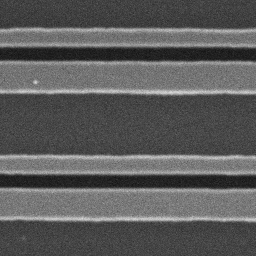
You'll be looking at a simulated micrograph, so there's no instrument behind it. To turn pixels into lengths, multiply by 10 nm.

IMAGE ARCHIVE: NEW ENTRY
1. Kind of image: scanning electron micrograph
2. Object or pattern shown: lines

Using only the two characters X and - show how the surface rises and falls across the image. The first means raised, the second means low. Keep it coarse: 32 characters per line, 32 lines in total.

--------------------------------
--------------------------------
--------------------------------
--------------------------------
XXXXXXXXXXXXXXXXXXXXXXXXXXXXXXXX
XXXXXXXXXXXXXXXXXXXXXXXXXXXXXXXX
--------------------------------
--------------------------------
XXXXXXXXXXXXXXXXXXXXXXXXXXXXXXXX
XXXXXXXXXXXXXXXXXXXXXXXXXXXXXXXX
XXXXXXXXXXXXXXXXXXXXXXXXXXXXXXXX
-----XX---------XXXXXXXXXXXXXXXX
--------------------------------
--------------------------------
--------------------------------
--------------------------------
--------------------------------
--------------------------------
--------------------------------
--------------------------------
XXXXXXXXXXXXXXXXXXXXXXXXXXXXXXXX
XXXXXXXXXXXXXXXXXXXXXXXXXXXXXXXX
--------------------------------
--------------------------------
XXXXXXXXXXXXXXXXXXXXXXXXXXXXXXXX
XXXXXXXXXXXXXXXXXXXXXXXXXXXXXXXX
XXXXXXXXXXXXXXXXXXXXXXXXXXXXXXXX
-----------XX---------X----XX-XX
--------------------------------
--------------------------------
--------------------------------
--------------------------------